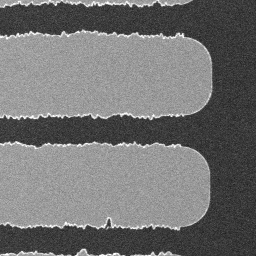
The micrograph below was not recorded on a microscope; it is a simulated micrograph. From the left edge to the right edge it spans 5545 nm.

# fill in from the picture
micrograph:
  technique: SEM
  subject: one or a few lines or trenches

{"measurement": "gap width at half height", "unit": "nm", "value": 1760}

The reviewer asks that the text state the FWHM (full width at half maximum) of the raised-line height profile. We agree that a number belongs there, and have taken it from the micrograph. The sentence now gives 632 nm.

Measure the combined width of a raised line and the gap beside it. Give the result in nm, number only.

2390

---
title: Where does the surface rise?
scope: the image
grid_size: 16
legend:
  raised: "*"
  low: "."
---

****************
****************
............****
.............***
.............***
.............***
.............***
****************
****************
............****
.............***
.............***
.............***
.............***
****************
****************